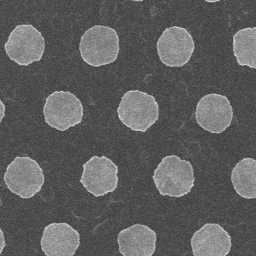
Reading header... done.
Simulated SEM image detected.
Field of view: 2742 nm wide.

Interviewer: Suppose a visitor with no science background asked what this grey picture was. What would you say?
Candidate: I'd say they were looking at a regular array of raised bodies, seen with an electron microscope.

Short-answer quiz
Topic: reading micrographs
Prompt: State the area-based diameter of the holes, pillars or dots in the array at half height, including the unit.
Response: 415 nm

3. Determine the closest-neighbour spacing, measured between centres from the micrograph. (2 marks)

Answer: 0.796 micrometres